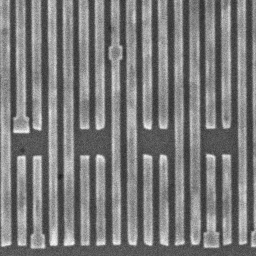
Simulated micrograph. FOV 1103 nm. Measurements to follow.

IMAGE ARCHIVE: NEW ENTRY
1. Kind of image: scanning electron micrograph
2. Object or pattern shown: wiring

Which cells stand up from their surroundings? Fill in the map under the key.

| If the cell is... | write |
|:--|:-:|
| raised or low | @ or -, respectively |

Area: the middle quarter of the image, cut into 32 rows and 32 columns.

@@--@@--@@--@@--@@--@@--@@--@---
@@--@@--@@--@@--@@--@@--@@--@---
@@--@@--@@--@@--@@--@@--@@--@@--
@@--@@--@@--@@--@@--@@--@@--@@--
@@--@@--@@--@@--@@--@@--@@--@@-@
@@--@@--@@--@@--@@--@@--@@--@@-@
@@--@@--@@--@@--@@--@@--@@--@@-@
@@--@@--@@--@@--@@--@@--@@--@@-@
@@--@@--@@--@@--@@--@@--@@--@@--
@@--@@--@@--@@--@@--@@--@@--@@-@
@@--@@--@@--@@--@@--@@--@@--@@-@
@@--@@--@@--@@--@@--@@--@@--@@-@
@@--@@--@@--@@--@@--@@--@@--@@-@
@@--@@--@@--@@--@@--@@--@@--@@--
@@--@@--@@--@@--@@--@@--@@--@@--
@@--@@--@@--@@--@@--@@--@@--@@--
@@----------@@--@@----------@@--
@@----------@@--@@----------@@--
@@----------@@--@@----------@@--
@@----------@@--@@----------@@--
@@----------@@--@@----------@@--
@@----------@@--@@----------@@--
@@----------@@--@@----------@@--
@@--@@--@@--@@--@@--@@--@@--@@--
@@--@@--@@--@@--@@--@@--@@--@@--
@@--@@--@@--@@--@@--@@--@@--@@--
@@--@@--@@--@@--@@--@@--@@--@@--
@@--@@--@@--@@--@@--@@--@@--@@--
@@--@@--@@--@@--@@--@@--@@--@@--
@@--@@--@@--@@--@@--@@--@@--@@--
@@--@@--@@--@@--@@--@@--@@--@@--
@@--@@--@@--@@--@@--@@--@@--@@--